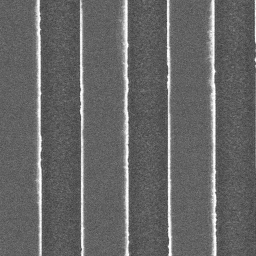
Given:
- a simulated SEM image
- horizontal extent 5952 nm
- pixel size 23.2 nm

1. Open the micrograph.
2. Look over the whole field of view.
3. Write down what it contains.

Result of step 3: lines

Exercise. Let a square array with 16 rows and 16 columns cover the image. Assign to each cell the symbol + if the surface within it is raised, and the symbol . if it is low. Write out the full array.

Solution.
++...+++..+++...
++...+++..+++...
++...+++..+++...
++...+++..+++...
++...+++...++...
+++..+++...++...
++...+++...++...
++...+++...++...
+++..+++...++...
+++..+++...++...
+++..+++...++...
+++..+++...++...
+++..+++...++...
+++..+++...++...
+++..+++...++...
+++..+++...++...